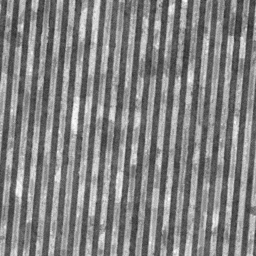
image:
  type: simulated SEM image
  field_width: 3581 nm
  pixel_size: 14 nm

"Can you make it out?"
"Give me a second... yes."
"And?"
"parallel lines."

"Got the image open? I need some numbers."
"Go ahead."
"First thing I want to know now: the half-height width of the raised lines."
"0.0784 µm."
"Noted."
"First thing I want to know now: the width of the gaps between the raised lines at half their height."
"92.3 nanometers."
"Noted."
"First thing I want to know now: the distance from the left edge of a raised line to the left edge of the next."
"173 nm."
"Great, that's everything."